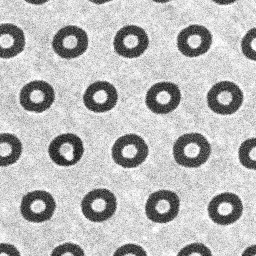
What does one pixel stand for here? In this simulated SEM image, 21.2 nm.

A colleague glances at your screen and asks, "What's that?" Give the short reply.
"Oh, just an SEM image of a regular array of ring-shaped grooves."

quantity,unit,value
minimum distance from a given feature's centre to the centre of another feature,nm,1290